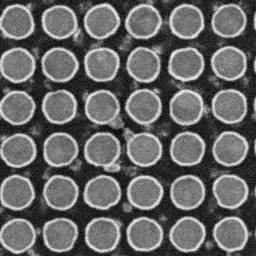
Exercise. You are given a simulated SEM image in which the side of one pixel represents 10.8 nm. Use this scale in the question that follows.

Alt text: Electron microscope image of a regular array of raised bodies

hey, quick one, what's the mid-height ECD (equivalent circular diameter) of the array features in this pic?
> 32.6 pixels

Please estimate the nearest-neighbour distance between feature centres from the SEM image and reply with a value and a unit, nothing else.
452 nm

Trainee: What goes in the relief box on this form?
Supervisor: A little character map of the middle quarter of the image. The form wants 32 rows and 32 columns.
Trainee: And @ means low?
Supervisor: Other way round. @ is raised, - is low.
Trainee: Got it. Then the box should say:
@@@---@@@@@@@---@@@@@@@@--@@@@@@
@@@---@@@@@@@---@@@@@@@@---@@@@@
@@----@@@@@@@----@@@@@@----@@@@@
@------@@@@@------@@@@-------@@@
--------------------------------
--------------------------------
--------------------------------
@------@@@@@-----@@@@@-------@@@
@@----@@@@@@@----@@@@@@-----@@@@
@@@---@@@@@@@---@@@@@@@@---@@@@@
@@@---@@@@@@@@--@@@@@@@@---@@@@@
@@@---@@@@@@@@--@@@@@@@@---@@@@@
@@@---@@@@@@@----@@@@@@----@@@@@
@@----@@@@@@@@----@@@@@----@@@@@
--------@@@@@@@----@@@------@@@@
------------@@@-----------------
---------------@----------------
----------@----@@-------------@@
@@-----@@@@@@--@@@@@@@@-----@@@@
@@@---@@@@@@@---@@@@@@@@---@@@@@
@@@---@@@@@@@@--@@@@@@@@---@@@@@
@@@--@@@@@@@@@--@@@@@@@@---@@@@@
@@@--@@@@@@@@---@@@@@@@@---@@@@@
@@----@@@@@@@----@@@@@@@---@@@@@
@------@@@@@------@@@@@-----@@@@
-----------@@-------------------
-----------@@-------------------
--------------------------------
--------@@@@-------@@@--------@@
@@-----@@@@@@----@@@@@@-----@@@@
@@@---@@@@@@@@--@@@@@@@@---@@@@@
@@@---@@@@@@@@--@@@@@@@@---@@@@@